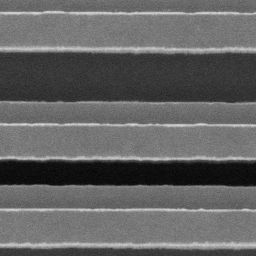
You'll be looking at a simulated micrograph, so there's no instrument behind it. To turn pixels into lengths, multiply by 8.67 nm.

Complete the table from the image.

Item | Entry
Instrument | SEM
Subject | lines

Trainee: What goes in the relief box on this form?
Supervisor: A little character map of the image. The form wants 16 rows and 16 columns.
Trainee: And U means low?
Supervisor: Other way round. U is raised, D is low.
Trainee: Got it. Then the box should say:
UUUUUUUUUUUUUUUU
UUUUUUUUUUUUUUUU
UUUUUUUUUUUUUUUU
DDDDDDDDDDDDDDDD
DDDDDDDDDDDDDDDD
DDDDDDDDDDDDDDDD
UUUUUUUUUUUUUUUU
UUUUUUUUUUUUUUUU
UUUUUUUUUUUUUUUU
UUUUUUUUUUUUUUUU
DDDDDDDDDDDDDDDD
DDDDDDDDDDDDDDDD
UUUUUUUUUUUUUUUU
UUUUUUUUUUUUUUUU
UUUUUUUUUUUUUUUU
DDDDDDDDDDDDDDDD